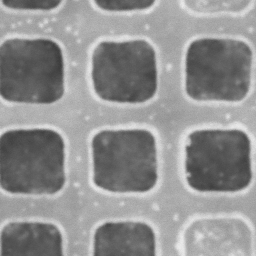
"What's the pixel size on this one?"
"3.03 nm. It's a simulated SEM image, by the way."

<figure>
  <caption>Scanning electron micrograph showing holes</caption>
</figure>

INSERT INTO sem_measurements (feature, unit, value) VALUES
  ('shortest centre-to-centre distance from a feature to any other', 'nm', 273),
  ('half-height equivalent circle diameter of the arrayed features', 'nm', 214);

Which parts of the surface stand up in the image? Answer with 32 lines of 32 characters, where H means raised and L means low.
LLLLLLLLHHHHLLLLLLLHHHHLLLLLLLLH
HHHHHHHHHHHHHHHHHHHHHHHHLLLHLLHH
HHHHHHHHHHHHHHHHHHHHHHHHHHHHHHHH
HHHHHHHHHHHHHHHHHHHHHHHHHHHHHHHH
HHHHHHHHHHHHHHHHHHHHHHHHHHHHHHHH
LLLLLLLHHHHHLLLLLLLHHHHHLLLLLLLH
LLLLLLLLHHHHLLLLLLLHHHHLLLLLLLLH
LLLLLLLLHHHLLLLLLLLLHHHLLLLLLLLL
LLLLLLLLHHHLLLLLLLLLHHHLLLLLLLLH
LLLLLLLLHHHLLLLLLLLLHHHLLLLLLLLH
LLLLLLLLHHHHLLLLLLLLHHHLLLLLLLLH
LLLLLLLLHHHHLLLLLLLLHHHLLLLLLLLH
HLLLLLLHHHHHHLLLLLLHHHHHLLLLLLHH
HHHHHHHHHHHHHHHHHHHHHHHHHHHHHHHH
HHHHHHHHHHHHHHHHHHHHHHHHHHHHHHHH
HHHHHHHHHHHHHHHHHHHHHHHHHHHHHHHH
LLLLLLLHHHHHLLLLLLLHHHHHLLLLLLLH
LLLLLLLLHHHLLLLLLLLHHHHLLLLLLLLH
LLLLLLLLHHHLLLLLLLLLHHHLLLLLLLLL
LLLLLLLLHHHHLLLLLLLLHHHLLLLLLLLH
LLLLLLLLHHHLLLLLLLLLHHHLLLLLLLLH
LLLLLLLLHHHHLLLLLLLLHHHLLLLLLLLL
LLLLLLLLHHHHLLLLLLLLHHHLLLLLLLLH
LLLLLLLLHHHHLLLLLLLHHHHHLLLLLLLH
HHHHHHHHHHHHHHHHHHHHHHHHHHHHHHHH
HHHHHHHHHHHHHHHHHHHHHHHHHHHHHHHH
HHHHHHHHHHHHHHHHHHHHHHHHHHHHHHHH
HHHHHHHHHHHHHHHHHHHHHHHHLLLLLLHH
LLLLLLLHHHHHLLLLLLLHHHHLLLLLLLLH
LLLLLLLLHHHHLLLLLLLHHHHLLLLLLLLL
LLLLLLLLHHHHLLLLLLLHHHHLLLLLLLLL
LLLLLLLLHHHHLLLLLLLLHHHLLLLLLLLL